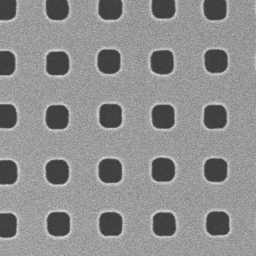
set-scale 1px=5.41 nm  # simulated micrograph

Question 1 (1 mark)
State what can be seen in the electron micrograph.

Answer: a regular array of holes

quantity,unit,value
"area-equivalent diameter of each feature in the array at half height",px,25.4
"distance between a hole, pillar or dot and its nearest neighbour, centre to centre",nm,285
